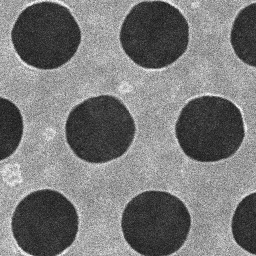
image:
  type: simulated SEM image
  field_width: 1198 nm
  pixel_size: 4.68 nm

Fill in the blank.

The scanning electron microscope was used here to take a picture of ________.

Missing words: holes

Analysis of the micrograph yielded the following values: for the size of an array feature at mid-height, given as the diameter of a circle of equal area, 319 nanometers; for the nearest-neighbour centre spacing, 506 nm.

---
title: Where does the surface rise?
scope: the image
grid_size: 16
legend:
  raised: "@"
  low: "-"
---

@@--@@@@---@@@@-
@----@@@----@@@-
@----@@@----@@--
@----@@@---@@@@-
@@@@@@@@@@@@@@@@
@@@@@@@@@@@@@@@@
-@@@@---@@@@---@
-@@@----@@@----@
-@@@----@@@----@
-@@@@---@@@@---@
@@@@@@@@@@@@@@@@
@@@@@@@@@@@@@@@@
@---@@@@---@@@@-
@----@@@----@@@-
@----@@@----@@@-
@---@@@@---@@@@-